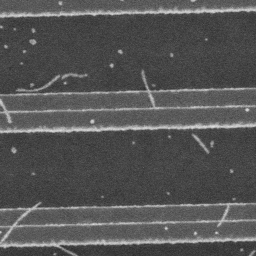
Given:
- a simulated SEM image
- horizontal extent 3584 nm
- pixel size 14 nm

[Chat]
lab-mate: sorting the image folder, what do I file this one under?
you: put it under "lines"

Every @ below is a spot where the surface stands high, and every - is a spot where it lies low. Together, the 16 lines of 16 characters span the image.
@@@@@@@@@@@@@@@@
----------------
----------------
----------------
----------------
----------------
@@@@@@@@@@@@@@@@
@@@@@@@@@@@@@@@@
----------------
----------------
----------------
----------------
----------------
@@@@@@@@@@@@@@@@
@@@@@@@@@@@@@@@@
----------------